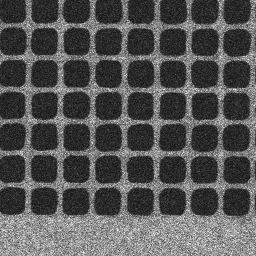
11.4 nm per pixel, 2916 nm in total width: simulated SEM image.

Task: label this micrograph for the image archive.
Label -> a regular array of holes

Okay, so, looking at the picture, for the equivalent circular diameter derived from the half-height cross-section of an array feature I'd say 332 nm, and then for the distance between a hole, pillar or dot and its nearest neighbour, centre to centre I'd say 361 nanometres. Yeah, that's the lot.